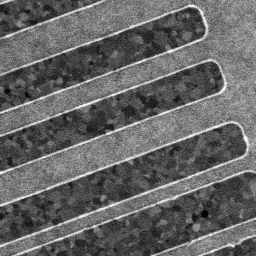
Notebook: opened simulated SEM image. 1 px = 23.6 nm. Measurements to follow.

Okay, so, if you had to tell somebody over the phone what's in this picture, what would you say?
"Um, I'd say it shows one or a few lines or trenches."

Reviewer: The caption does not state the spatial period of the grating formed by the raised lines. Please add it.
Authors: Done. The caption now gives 1440 nanometres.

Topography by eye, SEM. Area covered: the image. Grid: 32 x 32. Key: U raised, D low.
UUUUUUUUUUUUDDDDDDDDDDDDDDDDDDDD
UUUUUUUUUDDDDDDDDDDDDUUUUDDDDDDD
UUUUUUDDDDDDDDDDDDDUUUUUUUDDDDDD
UUUUDDDDDDDDDDDDUUUUUUUUUUDDDDDD
UDDDDDDDDDDDDDUUUUUUUUUUUUDDDDDD
DDDDDDDDDDUUUUUUUUUUUUUUDDDDDDDD
DDDDDDDDUUUUUUUUUUUUUDDDDDDDDDDD
DDDDDUUUUUUUUUUUUUDDDDDDDDDDDDDD
DDUUUUUUUUUUUUUDDDDDDDDUUUUUDDDD
UUUUUUUUUUUUUDDDDDDDUUUUUUUUDDDD
UUUUUUUUUUDDDDDDDDUUUUUUUUUUDDDD
UUUUUUUDDDDDDDDUUUUUUUUUUUUUDDDD
UUUUUDDDDDDDUUUUUUUUUUUUUDDDDDDD
UUDDDDDDDDUUUUUUUUUUUUDDDDDDDDDD
DDDDDDDUUUUUUUUUUUUUDDDDDDDDDDDD
DDDDUUUUUUUUUUUUUDDDDDDDDDDDUUDD
DUUUUUUUUUUUUUDDDDDDDDDDDUUUUUDD
UUUUUUUUUUUDDDDDDDDDDDDUUUUUUUUD
UUUUUUUUUDDDDDDDDDDDUUUUUUUUUUUD
UUUUUUDDDDDDDDDDDUUUUUUUUUUUUUDD
UUUDDDDDDDDDDDUUUUUUUUUUUUUUDDDD
UDDDDDDDDDDDUUUUUUUUUUUUUDDDDDUU
DDDDDDDDDUUUUUUUUUUUUUUDDDDDUUUU
DDDDDDUUUUUUUUUUUUUUDDDDDUUUUUUU
DDDDUUUUUUUUUUUUUDDDDDUUUUUUUUUU
DUUUUUUUUUUUUUDDDDDUUUUUUUUUUUUU
UUUUUUUUUUUUDDDDDUUUUUUUUUUUUUUU
UUUUUUUUUDDDDDUUUUUUUUUUUUUUUUUU
UUUUUUDDDDDUUUUUUUUUUUUUUUUUUDDD
UUUDDDDDUUUUUUUUUUUUUUUUUUDDDDDD
UDDDDDUUUUUUUUUUUUUUUUUUDDDDDDUU
DDDUUUUUUUUUUUUUUUUUUDDDDDUUUUUU